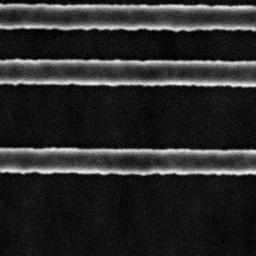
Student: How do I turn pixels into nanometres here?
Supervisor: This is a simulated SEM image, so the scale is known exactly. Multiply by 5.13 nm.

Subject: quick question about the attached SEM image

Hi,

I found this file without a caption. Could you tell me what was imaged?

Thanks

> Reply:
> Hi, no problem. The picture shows lines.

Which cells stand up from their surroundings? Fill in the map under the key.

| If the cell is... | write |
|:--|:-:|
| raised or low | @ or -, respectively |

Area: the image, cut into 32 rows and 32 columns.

--------------------------------
@@@@@@@@@@@@@@@@@@@@@@@@@@@@@@@@
@@@@@@@@@@@@@@@@@@@@@@@@@@@@@@@@
-@----@@@@@@@@@@@@@@@@@@@@@@@@@@
--------------------------------
--------------------------------
--------------------------------
--@-----------------------------
@@@@@@@@@@@@@@@@@@@@@@@@@@@@@@@@
@@@@@@@@@@@@@@@@@@@@@@@@@@@@@@@@
----------@@@@@@@@@@@-@@@@@@@@@@
--------------------------------
--------------------------------
--------------------------------
--------------------------------
--------------------------------
--------------------------------
--------------------------------
--------------------------------
@@@@@@@@@@@@@@@@@@@@@@@@@@@@@@@@
@@@@@@@@@@@@@@@@@@@@@@@@@@@@@@@@
-@@@@@@@@@@@@@@@@@@@@@@@@@@@@@@@
--------------------------------
--------------------------------
--------------------------------
--------------------------------
--------------------------------
--------------------------------
--------------------------------
--------------------------------
--------------------------------
--------------------------------